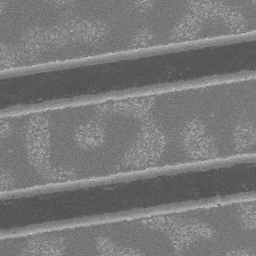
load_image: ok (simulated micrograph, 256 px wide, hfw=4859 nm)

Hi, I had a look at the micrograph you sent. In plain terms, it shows one or a few lines or trenches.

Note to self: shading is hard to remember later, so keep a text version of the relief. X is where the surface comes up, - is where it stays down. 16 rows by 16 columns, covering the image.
XXXXXXXXXXXXXXXX
XXXXXXXXXXXXXXXX
XXXXXXXXXXXXXX--
XXXXXXXX--------
X---------------
----------XXXXXX
----XXXXXXXXXXXX
XXXXXXXXXXXXXXXX
XXXXXXXXXXXXXXXX
XXXXXXXXXXXXXXXX
XXXXXXXXXXXX----
XXXXX-----------
--------------XX
-------XXXXXXXXX
-XXXXXXXXXXXXXXX
XXXXXXXXXXXXXXXX